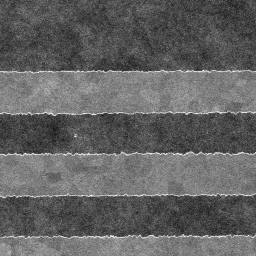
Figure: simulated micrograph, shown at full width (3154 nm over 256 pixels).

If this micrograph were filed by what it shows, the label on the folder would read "one or a few lines or trenches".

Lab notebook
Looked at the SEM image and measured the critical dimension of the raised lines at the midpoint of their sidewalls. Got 514 nm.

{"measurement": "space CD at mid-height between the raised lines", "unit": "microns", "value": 0.5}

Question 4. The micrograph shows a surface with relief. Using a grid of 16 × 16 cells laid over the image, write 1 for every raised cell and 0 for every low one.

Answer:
0000000000000000
0000000000000000
0000000000000000
0000000000000000
1011111111111111
1111111111111111
1111111111111111
0000000000000000
0000000000000000
0000000000000000
1111111111111111
1111111111111111
0000000000000000
0000000000000000
0000000000000000
1111111111111111